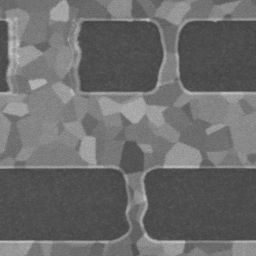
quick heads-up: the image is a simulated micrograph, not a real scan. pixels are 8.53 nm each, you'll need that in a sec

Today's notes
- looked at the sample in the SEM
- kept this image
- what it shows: one or a few lines or trenches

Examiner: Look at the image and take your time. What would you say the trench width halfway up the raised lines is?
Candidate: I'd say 630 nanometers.